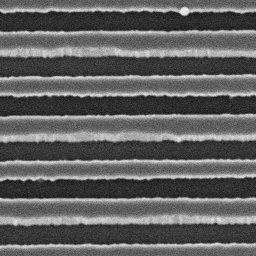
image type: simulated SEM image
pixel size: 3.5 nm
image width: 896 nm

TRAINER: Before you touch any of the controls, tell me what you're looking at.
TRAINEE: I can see lines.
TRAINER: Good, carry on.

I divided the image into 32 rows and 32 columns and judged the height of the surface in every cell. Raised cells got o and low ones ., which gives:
oooooooooooooooooooooooooooooooo
oo..oo..o......o....o.oooo.o.ooo
................................
................................
oooooooooooooooooooooooooooooooo
oooooooooooooooooooooooooooooooo
oooooooooooooooooooooooooooooooo
................................
................................
................oo.ooooooooooooo
oooooooooooooooooooooooooooooooo
oooooooooooooooooooooooooooooooo
................................
................................
........o..o.ooo.ooooooooooooooo
oooooooooooooooooooooooooooooooo
oooooooooooooooooooooooooooooooo
oo....................o.........
................................
................................
oooooooooooooooooooooooooooooooo
oooooooooooooooooooooooooooooooo
................................
................................
................................
oooooooooooooooooooooooooooooooo
oooooooooooooooooooooooooooooooo
oooooooooooooooooooooooooooooooo
................................
................................
..........................oo.oo.
oooooooooooooooooooooooooooooooo